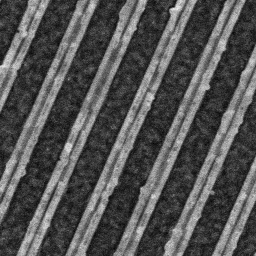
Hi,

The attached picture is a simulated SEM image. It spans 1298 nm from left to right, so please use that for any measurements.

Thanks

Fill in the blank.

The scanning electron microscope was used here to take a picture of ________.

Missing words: parallel lines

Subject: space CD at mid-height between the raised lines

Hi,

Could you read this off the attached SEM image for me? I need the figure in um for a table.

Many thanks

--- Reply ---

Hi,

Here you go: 0.16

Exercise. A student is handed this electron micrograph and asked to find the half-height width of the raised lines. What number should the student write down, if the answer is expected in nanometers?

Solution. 69.6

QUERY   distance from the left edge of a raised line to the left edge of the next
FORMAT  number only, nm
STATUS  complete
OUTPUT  228